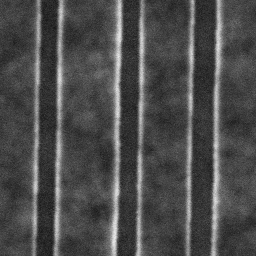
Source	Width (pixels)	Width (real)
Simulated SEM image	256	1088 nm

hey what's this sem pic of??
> lines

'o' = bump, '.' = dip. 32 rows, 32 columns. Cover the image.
ooooo...ooooooo...oooooo...ooooo
ooooo...ooooooo...oooooo...ooooo
ooooo...ooooooo...oooooo...ooooo
ooooo..oooooooo...oooooo...ooooo
ooooo..oooooooo...oooooo...ooooo
ooooo..oooooooo...oooooo...ooooo
ooooo..oooooooo...oooooo...ooooo
ooooo..oooooooo...oooooo...ooooo
ooooo..oooooooo...oooooo...ooooo
ooooo..oooooooo...oooooo...ooooo
ooooo..oooooooo...oooooo...ooooo
ooooo..oooooooo...oooooo...ooooo
ooooo..oooooooo..ooooooo...ooooo
ooooo..oooooooo..ooooooo...ooooo
ooooo..oooooooo..ooooooo...ooooo
ooooo..oooooooo..ooooooo...ooooo
ooooo..oooooooo..ooooooo...ooooo
ooooo..oooooooo..ooooooo...ooooo
ooooo..oooooooo..ooooooo...ooooo
ooooo..oooooooo..ooooooo...ooooo
ooooo..oooooooo..ooooooo...ooooo
ooooo..oooooooo..ooooooo...ooooo
ooooo..oooooooo..ooooooo...ooooo
ooooo..oooooooo..ooooooo...ooooo
ooooo..oooooooo..ooooooo...ooooo
oooo...oooooooo..ooooooo...ooooo
oooo...oooooooo..ooooooo...ooooo
oooo...oooooooo..ooooooo...ooooo
oooo...ooooooo...ooooooo...ooooo
oooo...ooooooo...ooooooo...ooooo
oooo...ooooooo...ooooooo...ooooo
oooo...ooooooo...ooooooo...ooooo